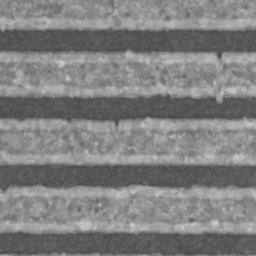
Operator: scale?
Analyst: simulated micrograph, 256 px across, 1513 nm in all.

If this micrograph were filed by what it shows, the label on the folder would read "one or a few lines or trenches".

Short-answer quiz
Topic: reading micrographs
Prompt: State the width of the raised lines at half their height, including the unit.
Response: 197 nanometers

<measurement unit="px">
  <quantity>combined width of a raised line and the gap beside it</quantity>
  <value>67.7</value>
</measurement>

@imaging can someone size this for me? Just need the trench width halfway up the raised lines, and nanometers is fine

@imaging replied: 203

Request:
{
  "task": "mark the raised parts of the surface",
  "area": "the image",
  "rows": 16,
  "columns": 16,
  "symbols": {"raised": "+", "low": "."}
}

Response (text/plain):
++++++++++++++++
.........++.....
................
................
++++++++++++++++
++++++++++++++++
................
................
++++++++++++++++
++++++++++++++++
................
................
++++++++++++++++
++++++++++++++++
................
................